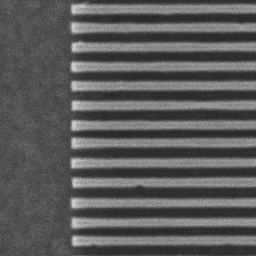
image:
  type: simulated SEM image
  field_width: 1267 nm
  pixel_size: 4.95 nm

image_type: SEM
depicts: parallel lines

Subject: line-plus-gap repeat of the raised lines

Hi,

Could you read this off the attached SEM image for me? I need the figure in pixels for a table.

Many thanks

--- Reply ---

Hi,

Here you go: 19.3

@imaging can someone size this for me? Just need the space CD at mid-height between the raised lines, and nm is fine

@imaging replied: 52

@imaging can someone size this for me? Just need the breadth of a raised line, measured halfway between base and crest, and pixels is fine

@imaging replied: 8.51